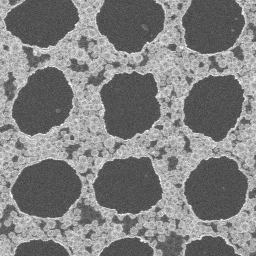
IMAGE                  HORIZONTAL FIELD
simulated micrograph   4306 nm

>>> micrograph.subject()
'holes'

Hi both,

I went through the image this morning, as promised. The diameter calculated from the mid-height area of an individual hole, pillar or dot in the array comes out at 1.07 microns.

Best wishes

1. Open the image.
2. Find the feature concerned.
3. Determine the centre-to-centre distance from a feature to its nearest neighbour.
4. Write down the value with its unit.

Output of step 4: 1.38 um